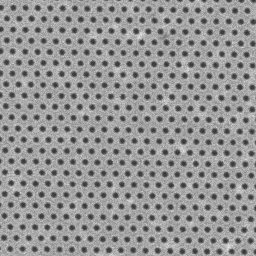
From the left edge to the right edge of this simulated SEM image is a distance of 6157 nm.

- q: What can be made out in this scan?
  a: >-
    a regular array of holes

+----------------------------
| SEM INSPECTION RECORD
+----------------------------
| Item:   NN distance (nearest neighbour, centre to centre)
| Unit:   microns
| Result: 0.291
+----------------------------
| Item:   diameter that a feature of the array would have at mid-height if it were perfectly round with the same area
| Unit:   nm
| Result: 149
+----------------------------